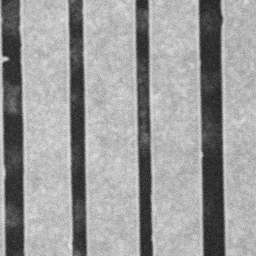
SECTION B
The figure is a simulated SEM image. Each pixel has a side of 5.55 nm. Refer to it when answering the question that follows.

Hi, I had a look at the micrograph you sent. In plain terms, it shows one or a few lines or trenches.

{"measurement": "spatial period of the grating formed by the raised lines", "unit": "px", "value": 64.6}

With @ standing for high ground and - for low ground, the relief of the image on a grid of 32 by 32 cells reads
---@@@@@---@@@@@@--@@@@@@---@@@@
---@@@@@---@@@@@@--@@@@@@---@@@@
---@@@@@---@@@@@@--@@@@@@---@@@@
---@@@@@---@@@@@@--@@@@@@---@@@@
---@@@@@---@@@@@@--@@@@@@---@@@@
---@@@@@---@@@@@@--@@@@@@---@@@@
---@@@@@---@@@@@@--@@@@@@---@@@@
---@@@@@@--@@@@@@--@@@@@@---@@@@
---@@@@@@--@@@@@@--@@@@@@---@@@@
---@@@@@@--@@@@@@--@@@@@@---@@@@
---@@@@@@--@@@@@@--@@@@@@---@@@@
---@@@@@@--@@@@@@--@@@@@@---@@@@
---@@@@@---@@@@@@--@@@@@@---@@@@
---@@@@@@--@@@@@@--@@@@@@---@@@@
---@@@@@@--@@@@@@--@@@@@@---@@@@
---@@@@@@--@@@@@@--@@@@@@---@@@@
---@@@@@@--@@@@@@--@@@@@@---@@@@
---@@@@@@--@@@@@@--@@@@@@---@@@@
---@@@@@@--@@@@@@--@@@@@@---@@@@
---@@@@@@--@@@@@@--@@@@@@---@@@@
---@@@@@@--@@@@@@--@@@@@@---@@@@
@--@@@@@@--@@@@@@--@@@@@@---@@@@
---@@@@@@--@@@@@@--@@@@@@---@@@@
---@@@@@@--@@@@@@--@@@@@@---@@@@
---@@@@@@--@@@@@@--@@@@@@---@@@@
---@@@@@@--@@@@@@--@@@@@@---@@@@
---@@@@@@--@@@@@@--@@@@@@---@@@@
---@@@@@@--@@@@@@--@@@@@@---@@@@
---@@@@@@--@@@@@@--@@@@@@---@@@@
---@@@@@@--@@@@@@--@@@@@@---@@@@
---@@@@@@--@@@@@@--@@@@@@---@@@@
---@@@@@@--@@@@@@--@@@@@@---@@@@